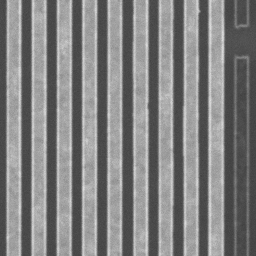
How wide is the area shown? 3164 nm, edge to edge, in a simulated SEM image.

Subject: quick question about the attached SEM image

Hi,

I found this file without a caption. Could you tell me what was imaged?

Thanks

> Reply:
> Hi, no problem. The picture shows parallel lines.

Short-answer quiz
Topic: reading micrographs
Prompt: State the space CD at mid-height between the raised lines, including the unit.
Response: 161 nm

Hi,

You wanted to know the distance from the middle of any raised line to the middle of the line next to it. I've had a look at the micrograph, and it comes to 0.313 micrometres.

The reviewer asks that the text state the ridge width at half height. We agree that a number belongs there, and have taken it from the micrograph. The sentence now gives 0.151 µm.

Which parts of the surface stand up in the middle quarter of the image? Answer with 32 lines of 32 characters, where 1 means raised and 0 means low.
11000111000111000011100011100011
11000111000111000011100011100011
11000111000111000011100011100011
11000111000111000011100011100011
11000111000111000011100011100011
11000111000111000011100011100011
11000111000111000011100011100011
11000111000111000011100011100011
11000111000111000011100011100011
11000111000111000011100011100011
11000111000111000011100011100011
11000111000111000011100011100011
11000111000111000011100011100011
11000111000111000011100011100011
11000111000111000011100011100011
11000111000111000011100011100011
11000111000111000011100011100011
11000111000111000011100011100011
11000111000111000011100011100011
11000111000111000011100011100011
11000111000111000011100011100011
11000111000111000011100011100011
11000111000111000011100011100011
11000111000111000011100011100011
11000111000111000011100011100011
11000111000111000011100011100011
11000111000111000011100011100011
11000111000111000011100011100011
11000111000111000011100011100011
11000111000111000011100011100011
11000111000111000011100011100011
11000111000111000011100011100011